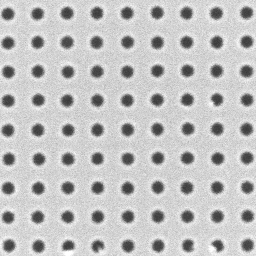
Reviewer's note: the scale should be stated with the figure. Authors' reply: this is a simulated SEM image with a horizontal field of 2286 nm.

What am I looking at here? a regular array of holes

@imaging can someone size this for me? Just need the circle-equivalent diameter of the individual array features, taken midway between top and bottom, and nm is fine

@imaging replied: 126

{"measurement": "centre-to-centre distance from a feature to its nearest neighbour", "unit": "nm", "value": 257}